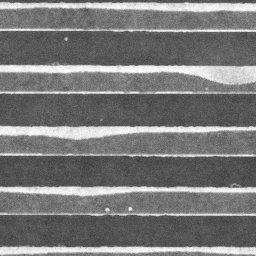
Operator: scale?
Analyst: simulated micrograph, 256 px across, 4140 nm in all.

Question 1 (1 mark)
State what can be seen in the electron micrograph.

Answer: lines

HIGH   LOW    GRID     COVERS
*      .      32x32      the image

................................
********************************
********************************
********************************
................................
................................
................................
................................
................................
********************************
********************************
********************************
................................
................................
................................
................................
*********..*********************
********************************
********************************
................................
................................
................................
................................
................................
********************************
********************************
********************************
................................
................................
................................
................................
********************************